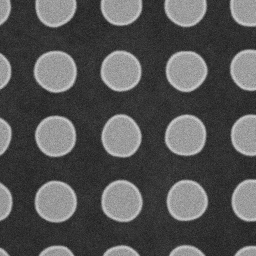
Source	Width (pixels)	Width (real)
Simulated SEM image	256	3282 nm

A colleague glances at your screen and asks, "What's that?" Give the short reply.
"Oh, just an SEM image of an array of small figures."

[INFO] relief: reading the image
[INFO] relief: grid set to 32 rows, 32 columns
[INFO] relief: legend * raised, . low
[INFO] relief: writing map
*...*****....*****...*****...***
*....****....*****...*****...***
*....****....****....****....***
................................
................................
................................
......**......**......**......**
*....****....****....****....***
*...******...*****...*****...***
*...******...*****...*****...***
*....****....****....****.....**
.......*........................
................................
................................
..............**.......*.......*
*....****....****....****....***
*...*****....*****...*****...***
*...*****....*****...*****...***
*....****....****....****....***
......**......**................
................................
................................
................................
*....****....****....****.....**
*...*****....*****...*****...***
*...******...*****...*****...***
*....****....****....****....***
......**......**......**......**
................................
................................
................................
*....****....****....****.....**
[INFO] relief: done